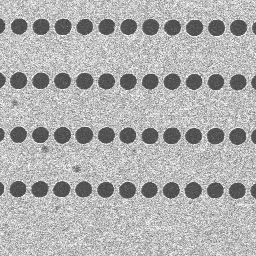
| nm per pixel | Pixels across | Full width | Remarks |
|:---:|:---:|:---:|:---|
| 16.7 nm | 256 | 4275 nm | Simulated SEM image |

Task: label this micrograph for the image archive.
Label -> a regular array of holes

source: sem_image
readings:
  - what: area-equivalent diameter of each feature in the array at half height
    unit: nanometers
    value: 283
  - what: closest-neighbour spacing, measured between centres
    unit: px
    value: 21.8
